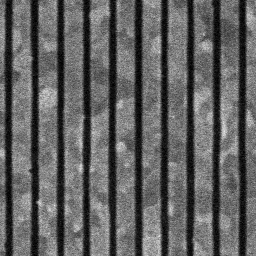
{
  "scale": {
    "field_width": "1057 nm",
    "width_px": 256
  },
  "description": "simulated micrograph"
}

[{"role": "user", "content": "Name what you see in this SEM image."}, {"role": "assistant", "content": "parallel lines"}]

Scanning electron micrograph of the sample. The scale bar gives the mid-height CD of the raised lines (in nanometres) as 69.7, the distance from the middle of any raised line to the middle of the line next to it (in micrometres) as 0.107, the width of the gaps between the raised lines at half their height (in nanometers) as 36.6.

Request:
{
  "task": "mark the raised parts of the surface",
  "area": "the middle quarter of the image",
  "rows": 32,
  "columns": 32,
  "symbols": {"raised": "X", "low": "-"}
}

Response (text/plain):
XXXX---XXXX---XXX---XXXX--XXXX--
XXXX---XXXX--XXXX---XXXX--XXXX--
XXXX---XXXX--XXXX---XXXX--XXXX--
XXXX---XXXX--XXXX---XXXX--XXXX--
XXXX---XXXX--XXXX---XXXX--XXXX--
XXXX---XXXX--XXXX---XXXX--XXXX--
XXXX---XXXX--XXXX---XXXX--XXXX--
XXXX---XXXX--XXXX---XXXX--XXXX--
XXXX---XXXX--XXXX---XXXX--XXXX--
-XXX---XXXX--XXXX---XXXX--XXXX--
-XXX---XXXX--XXXX---XXXX--XXXX--
XXXX---XXXX--XXXX---XXXX--XXXX--
XXXX---XXXX--XXXX---XXXX--XXXX--
XXXXX--XXXX--XXXX---XXXX--XXXX--
XXXX---XXXX--XXXX---XXXX--XXXX--
XXXX---XXXX--XXXX---XXXX--XXXX--
XXXX---XXXX--XXXX---XXXX--XXXX--
XXXX---XXXX--XXXX---XXXX--XXXX--
XXXX---XXXX--XXXX---XXXX--XXXX--
XXXX---XXXX--XXXX---XXXX--XXXX--
-XXX---XXXX--XXXX---XXXX--XXXX--
-XXX---XXXX--XXXX---XXXX--XXXX--
-XXX---XXXX--XXXX---XXXX--XXXX--
-XXX---XXXX--XXXX---XXXX--XXXX--
-XXX---XXXX--XXXX---XXXX--XXXX--
-XXX---XXXX--XXXX---XXXX--XXXX--
-XXX---XXXX--XXXX---XXXX--XXXX--
-XXX---XXXX--XXXX---XXXX--XXXX--
-XXX---XXXX--XXXX---XXXX--XXXX--
-XXX---XXXX--XXXX---XXXX--XXXX--
-XXX---XXXX--XXXX---XXXX--XXXX--
-XXX---XXXX--XXXX---XXXX--XXXX--